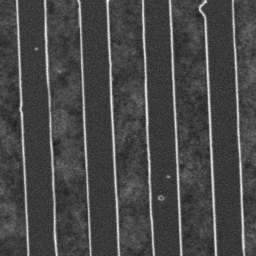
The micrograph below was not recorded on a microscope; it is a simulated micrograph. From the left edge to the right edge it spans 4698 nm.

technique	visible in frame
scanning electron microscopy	one or a few lines or trenches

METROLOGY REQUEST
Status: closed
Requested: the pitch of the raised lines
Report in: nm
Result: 1150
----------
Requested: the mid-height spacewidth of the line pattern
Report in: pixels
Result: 34.1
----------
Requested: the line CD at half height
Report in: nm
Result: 513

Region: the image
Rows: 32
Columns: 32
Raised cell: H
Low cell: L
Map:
LLHHHHLLLLHHHHLLLLHHHLLLLHHHHLLL
LLHHHHLLLLHHHHLLLLHHHLLLLHHHHLLL
LLHHHHLLLLHHHHLLLLHHHLLLLLHHHLLL
LLHHHHLLLLHHHHLLLLHHHLLLLLHHHLLL
LLHHHHLLLLHHHHLLLLHHHLLLLLHHHLLL
LLHHHHLLLLHHHHLLLLHHHLLLLLHHHLLL
LLHHHHLLLLHHHHLLLLHHHLLLLLHHHLLL
LLHHHHLLLLHHHHLLLLHHHHLLLLHHHLLL
LLLHHHLLLLHHHHLLLLHHHHLLLLHHHLLL
LLLHHHLLLLHHHHLLLLHHHHLLLLHHHHLL
LLLHHHLLLLHHHHLLLLHHHHLLLLHHHHLL
LLLHHHLLLLHHHHLLLLHHHHLLLLHHHHLL
LLLHHHLLLLHHHHLLLLHHHHLLLLHHHHLL
LLLHHHLLLLLHHHLLLLHHHHLLLLHHHHLL
LLLHHHLLLLLHHHLLLLHHHHLLLLHHHHLL
LLLHHHLLLLLHHHLLLLHHHHLLLLHHHHLL
LLLHHHLLLLLHHHLLLLHHHHLLLLHHHHLL
LLLHHHLLLLLHHHLLLLLHHHLLLLHHHHLL
LLLHHHLLLLLHHHLLLLLHHHLLLLHHHHLL
LLLHHHHLLLLHHHLLLLLHHHLLLLLHHHLL
LLLHHHHLLLLHHHLLLLLHHHLLLLLHHHLL
LLLHHHHLLLLHHHLLLLLHHHLLLLLHHHLL
LLLHHHHLLLLHHHLLLLLHHHLLLLLHHHLL
LLLHHHHLLLLHHHLLLLLHHHLLLLLHHHLL
LLLHHHHLLLLHHHHLLLLHHHLLLLLHHHLL
LLLHHHHLLLLHHHHLLLLHHHLLLLLHHHLL
LLLHHHHLLLLHHHHLLLLHHHLLLLLHHHLL
LLLHHHHLLLLHHHHLLLLHHHLLLLLHHHLL
LLLHHHHLLLLHHHHLLLLHHHLLLLLHHHLL
LLLHHHHLLLLHHHHLLLLHHHHLLLLHHHLL
LLLLHHHLLLLHHHHLLLLHHHHLLLLHHHLL
LLLLHHHLLLLHHHHLLLLHHHHLLLLHHHLL